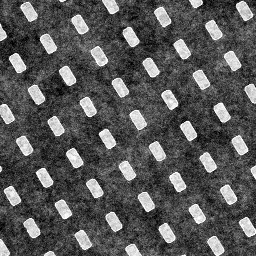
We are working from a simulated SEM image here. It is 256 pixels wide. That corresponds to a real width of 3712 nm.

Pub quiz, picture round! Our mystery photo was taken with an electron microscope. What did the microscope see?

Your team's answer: a regular array of raised bodies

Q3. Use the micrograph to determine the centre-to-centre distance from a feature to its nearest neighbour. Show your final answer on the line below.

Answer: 36.4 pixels